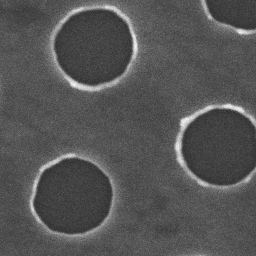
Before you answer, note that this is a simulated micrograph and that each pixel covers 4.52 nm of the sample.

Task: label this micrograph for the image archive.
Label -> holes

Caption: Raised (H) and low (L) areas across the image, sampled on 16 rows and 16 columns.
HHHHHHHHHHHHHLLL
HHHHLLLLHHHHHHLL
HHHLLLLLHHHHHHHH
HHHLLLLLHHHHHHHH
HHHHLLLLHHHHHHHH
HHHHHHHHHHHHHHHH
HHHHHHHHHHHHHHHH
HHHHHHHHHHHHLLLL
HHHHHHHHHHHLLLLL
HHHHHHHHHHHLLLLL
HHHLLLHHHHHHLLLL
HHLLLLLHHHHHHLLH
HHLLLLLHHHHHHHHH
HHLLLLLHHHHHHHHH
HHHHLHHHHHHHHHHH
HHHHHHHHHHHHHHHH